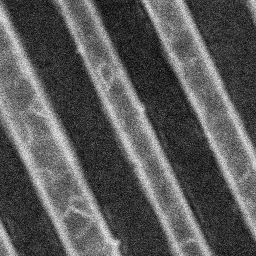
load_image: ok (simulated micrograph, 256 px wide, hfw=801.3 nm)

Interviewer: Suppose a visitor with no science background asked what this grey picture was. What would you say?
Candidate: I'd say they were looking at one or a few lines or trenches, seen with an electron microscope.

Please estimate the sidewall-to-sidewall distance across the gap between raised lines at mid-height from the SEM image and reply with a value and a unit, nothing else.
156 nm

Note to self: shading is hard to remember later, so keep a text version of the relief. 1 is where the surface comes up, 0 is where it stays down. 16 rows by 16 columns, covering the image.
0000110001110000
1000110000110000
1000011000110000
1000011000011000
1100001100011000
1100001100001100
1110000110001100
1110000110000110
0111000111000110
0111000011000111
0011100001100011
0011100001100011
0001110000110001
0001110000110001
0000111000110000
1000111000011000